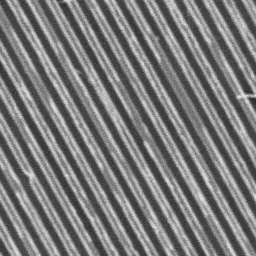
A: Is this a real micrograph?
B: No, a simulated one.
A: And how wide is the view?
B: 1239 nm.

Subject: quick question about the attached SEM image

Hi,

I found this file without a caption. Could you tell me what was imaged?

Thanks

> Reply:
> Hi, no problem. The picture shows parallel lines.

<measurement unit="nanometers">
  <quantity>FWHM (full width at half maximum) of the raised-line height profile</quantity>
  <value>42.3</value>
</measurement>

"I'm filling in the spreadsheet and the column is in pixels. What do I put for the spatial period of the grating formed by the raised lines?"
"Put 17.1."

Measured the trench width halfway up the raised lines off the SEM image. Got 8.74 px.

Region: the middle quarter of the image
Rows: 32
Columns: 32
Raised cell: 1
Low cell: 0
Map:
11000110011100011000110011000110
11100110001110011000110001100011
01100011000110001100111001110011
01110011100111001100011000110001
00110001100011000110001100011000
00011000110011100111001100011000
10011100110001100011000110001100
10001100011001110011100111001110
11001110011000110001100011000110
11000110001100011000110011100111
11100111001100011000110001100011
01100011000110001100011001110011
00110011100111001110011000110001
00110001100011000110001100111000
00011000110001100111001100011000
10011100110001100011000110001100
10001100011000110011100111001110
11001110011100110001100011000110
11000110001100011000110001100111
01100111001110011000110001100011
01100011000110001100111000110011
00110011100111001110011100110001
00111001100011000110011100011001
00011000110001100011001110011100
10011000111001110011000110001100
10001100011000110001100111001110
11001110011100111001100011000110
11000110001100011000110001100011
01100011001110011100110001100011
01110011000110001100011000110001
00110001100111001110011100111001
00111001100011000110001100011000